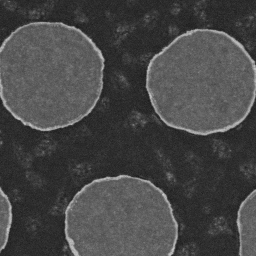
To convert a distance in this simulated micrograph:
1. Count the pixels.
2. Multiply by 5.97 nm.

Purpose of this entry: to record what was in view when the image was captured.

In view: raised bodies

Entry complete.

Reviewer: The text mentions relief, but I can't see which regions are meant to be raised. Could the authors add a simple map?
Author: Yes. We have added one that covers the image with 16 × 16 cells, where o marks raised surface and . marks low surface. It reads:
................
..oo............
oooooo.....oooo.
oooooo....oooooo
oooooo...ooooooo
oooooo...ooooooo
oooooo....oooooo
.oooo.....ooooo.
................
................
................
......ooo.......
.....ooooo.....o
o...ooooooo....o
o...ooooooo....o
....ooooooo....o